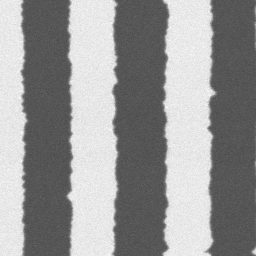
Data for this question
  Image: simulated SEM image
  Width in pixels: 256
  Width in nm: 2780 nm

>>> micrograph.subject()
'one or a few lines or trenches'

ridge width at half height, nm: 566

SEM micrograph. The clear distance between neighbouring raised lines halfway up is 452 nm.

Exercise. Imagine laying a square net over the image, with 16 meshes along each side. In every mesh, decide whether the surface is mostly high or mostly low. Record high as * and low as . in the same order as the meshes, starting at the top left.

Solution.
.***...****..***
.***...****..***
.***...***...***
.***...****..***
.****..***...***
.***...***...***
.****..***...***
.****..***...***
.****..***...***
.****..***...***
.****..***...***
.****..***...***
.***...****..***
.****..***...***
.****..***...***
.***...***...***